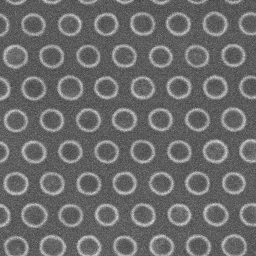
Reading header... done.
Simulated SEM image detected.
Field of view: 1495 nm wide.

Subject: a regular array of raised bodies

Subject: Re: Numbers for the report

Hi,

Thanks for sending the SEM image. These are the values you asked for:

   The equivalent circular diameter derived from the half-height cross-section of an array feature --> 133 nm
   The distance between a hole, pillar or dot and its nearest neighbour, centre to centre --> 211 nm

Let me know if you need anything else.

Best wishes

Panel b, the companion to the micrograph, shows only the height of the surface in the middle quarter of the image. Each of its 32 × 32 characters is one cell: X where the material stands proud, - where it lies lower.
-----XX-------XX-------XX-------
--------------------------------
--------------------------------
XXX------XXX------XXX-------XX--
XXXX----XXXXX----XXXXX----XXXXX-
XXXX----XXXXX----XXXXX----XXXXXX
XXXX----XXXXX----XXXXX----XXXXXX
XXXX----XXXXX----XXXXX-----XXXX-
XXX-------X--------XX-------XX--
--------------------------------
--------------------------------
-----XX-------XX-------XXX------
----XXXX----XXXXX-----XXXXX----X
---XXXXXX---XXXXXX---XXXXXX----X
---XXXXXX---XXXXXX---XXXXXX----X
----XXXXX----XXXXX----XXXXX----X
-----XXX------XX-------XX-------
--------------------------------
--------------------------------
XXX-------XX------XXX-------XX--
XXXX----XXXXX----XXXXX----XXXXX-
XXXX----XXXXX----XXXXX----XXXXXX
XXXX----XXXXX----XXXXX----XXXXXX
XXXX----XXXXX----XXXXX-----XXXX-
-XX-------XX-------XX-----------
--------------------------------
--------------------------------
-----XX-------XXX------XXX------
----XXXXX----XXXXX----XXXXX----X
---XXXXXX---XXXXXX---XXXXXX----X
---XXXXXX----XXXXX---XXXXXX----X
----XXXXX----XXXX-----XXXXX----X